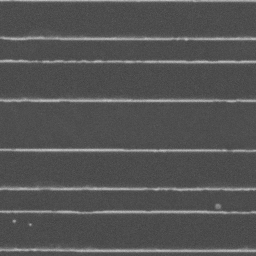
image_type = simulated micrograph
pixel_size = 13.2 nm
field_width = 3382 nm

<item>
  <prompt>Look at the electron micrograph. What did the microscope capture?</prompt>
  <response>lines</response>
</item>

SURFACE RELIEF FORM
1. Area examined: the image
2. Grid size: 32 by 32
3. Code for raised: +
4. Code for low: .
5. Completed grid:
++++++++++++++++++++++++++++++++
++++++++++++++++++++++++++++++++
++++++++++++++++++++++++++++++++
++++++++++++++++++++++++++++++++
++++++++++++++++++++++++++++++++
................................
................................
................................
++++++++++++++++++++++++++++++++
++++++++++++++++++++++++++++++++
++++++++++++++++++++++++++++++++
++++++++++++++++++++++++++++++++
++++++++++++++++++++++++++++++++
................................
................................
................................
................................
................................
................................
++++++++++++++++++++++++++++++++
++++++++++++++++++++++++++++++++
++++++++++++++++++++++++++++++++
++++++++++++++++++++++++++++++++
++++++++++++++++++++++++++++++++
................................
................................
++++++++++..+++++++++++++++.....
++++++++++++++++++++++++++++++++
++++++++++++++++++++++++++++++++
++++++++++++++++++++++++++++++++
++++++++++++++++++++++++++++++++
................................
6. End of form